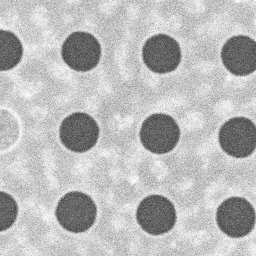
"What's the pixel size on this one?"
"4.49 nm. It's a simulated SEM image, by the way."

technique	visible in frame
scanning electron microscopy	holes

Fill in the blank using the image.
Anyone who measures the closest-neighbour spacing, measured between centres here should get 358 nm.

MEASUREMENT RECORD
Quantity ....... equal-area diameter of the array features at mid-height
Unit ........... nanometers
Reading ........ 183